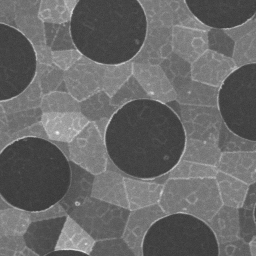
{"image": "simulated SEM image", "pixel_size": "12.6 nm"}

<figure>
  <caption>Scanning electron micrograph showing holes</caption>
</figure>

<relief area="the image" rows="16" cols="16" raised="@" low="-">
@@@@@----@@@----
@@@@-----@@@@--@
--@@@----@@@@@@@
--@@@---@@@@@@@@
--@@@@@@@@@@@@@-
--@@@@@@@@@@@@--
@@@@@@@@--@@@@--
@@@@@@@----@@@--
@@@@@@@-----@@@-
----@@@----@@@@@
----@@@----@@@@@
----@@@@@@@@@@@@
----@@@@@@@@@@@@
@@@@@@@@@@--@@@@
@@@@@@@@@----@@@
@@@@@@@@@-----@@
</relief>